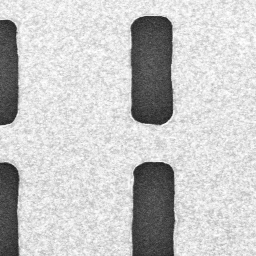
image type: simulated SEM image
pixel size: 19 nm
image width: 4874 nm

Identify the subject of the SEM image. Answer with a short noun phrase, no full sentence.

holes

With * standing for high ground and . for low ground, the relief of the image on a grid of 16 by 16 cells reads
****************
.*******...*****
.*******...*****
.*******...*****
.*******...*****
.*******...*****
.*******...*****
.********..*****
****************
****************
.********..*****
.*******...*****
.*******...*****
.*******...*****
.*******...*****
.*******...*****